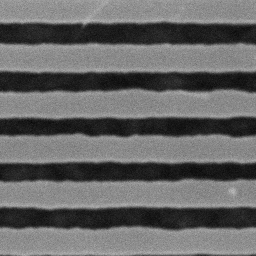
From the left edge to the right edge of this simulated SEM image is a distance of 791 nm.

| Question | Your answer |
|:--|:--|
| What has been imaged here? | lines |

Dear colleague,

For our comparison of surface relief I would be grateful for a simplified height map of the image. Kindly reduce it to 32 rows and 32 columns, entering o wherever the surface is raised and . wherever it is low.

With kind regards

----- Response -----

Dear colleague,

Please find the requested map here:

oooooooooooooooooooooooooooooooo
oooooooooooooooooooooooooooooooo
oooooooooooooooooooooooooooooooo
................................
................................
................................
oooooooooooooooooooooooooooooooo
oooooooooooooooooooooooooooooooo
oooooooooooooooooooooooooooooooo
................................
................................
......oo...oooooooo.oooo..ooooo.
oooooooooooooooooooooooooooooooo
oooooooooooooooooooooooooooooooo
oooooooooooooooooooooooooooooo..
................................
................................
oooooooooooooooooooooooooooooooo
oooooooooooooooooooooooooooooooo
oooooooooooooooooooooooooooooooo
................................
................................
.......................oo.....o.
oooooooooooooooooooooooooooooooo
oooooooooooooooooooooooooooooooo
oooooooooooooooooooooooooooooooo
................................
................................
...............ooo..............
oooooooooooooooooooooooooooooooo
oooooooooooooooooooooooooooooooo
oooooooooooooooooooooooooooooooo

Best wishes